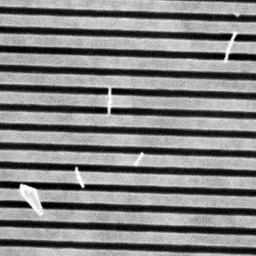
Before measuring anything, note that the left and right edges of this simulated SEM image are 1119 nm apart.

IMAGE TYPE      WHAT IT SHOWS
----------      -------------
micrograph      parallel lines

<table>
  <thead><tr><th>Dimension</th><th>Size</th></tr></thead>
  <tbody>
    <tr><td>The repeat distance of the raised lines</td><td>84.6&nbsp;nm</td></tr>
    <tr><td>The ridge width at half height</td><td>53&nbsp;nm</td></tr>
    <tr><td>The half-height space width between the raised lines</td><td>32.2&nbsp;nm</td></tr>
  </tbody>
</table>